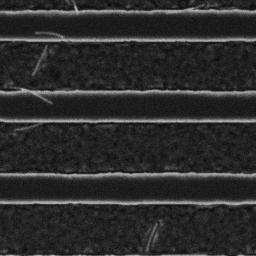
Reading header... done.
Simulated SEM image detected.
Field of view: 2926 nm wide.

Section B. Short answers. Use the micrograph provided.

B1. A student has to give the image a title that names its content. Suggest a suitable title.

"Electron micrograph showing lines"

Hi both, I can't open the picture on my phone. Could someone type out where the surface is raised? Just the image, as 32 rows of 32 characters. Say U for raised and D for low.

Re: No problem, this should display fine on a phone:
DDDDDDDDDDDDDDDDDDDDDDDDDDDDDDDD
UUUUUUUUUUUUUUUUUUUUUUUUUUUUUUUU
UUUUUUUUUUUUUUUUUUUUUUUUUUUUUUUU
UUUUUUUUUUUUUUUUUUUUUUUUUUUUUUUU
UUUUUUUUUUUUUUUUUUUUUUUUUUUUUUUU
DDDDDDDDDDDDDDDDDDDDDDDDDDDDDDDD
DDDDDDDDDDDDDDDDDDDDDDDDDDDDDDDD
DDDDDDDDDDDDDDDDDDDDDDDDDDDDDDDD
DDDDDDDDDDDDDDDDDDDDDDDDDDDDDDDD
DDDDDDDDDDDDDDDDDDDDDDDDDDDDDDDD
DDDDDDDDDDDDDDDDDDDDDDDDDDDDDDDD
UDUUUUDUDUUUUUUUUDUUUUUUUUDDDDDU
UUUUUUUUUUUUUUUUUUUUUUUUUUUUUUUU
UUUUUUUUUUUUUUUUUUUUUUUUUUUUUUUU
UUUUUUUUUUUUUUUUUUUUUUUUUUUUUUUU
DDDDDDDDDDDDDDDDDDDDDDDDDDDDDDDD
DDDDDDDDDDDDDDDDDDDDDDDDDDDDDDDD
DDDDDDDDDDDDDDDDDDDDDDDDDDDDDDDD
DDDDDDDDDDDDDDDDDDDDDDDDDDDDDDDD
DDDDDDDDDDDDDDDDDDDDDDDDDDDDDDDD
DDDDDDDDDDDDDDDDDDDDDDDDDDDDDDDD
DDDDDDDDDDDDDDDDDDDDDDDDDDDDDDDD
UUUUUUUUUUUUUUUUUUUUUUUUUUUUUUUU
UUUUUUUUUUUUUUUUUUUUUUUUUUUUUUUU
UUUUUUUUUUUUUUUUUUUUUUUUUUUUUUUU
DDDDDDDDDDDDDDDDDDDDDDDDDDDDDDDD
DDDDDDDDDDDDDDDDDDDDDDDDDDDDDDDD
DDDDDDDDDDDDDDDDDDDDDDDDDDDDDDDD
DDDDDDDDDDDDDDDDDDDDDDDDDDDDDDDD
DDDDDDDDDDDDDDDDDDDDDDDDDDDDDDDD
DDDDDDDDDDDDDDDDDDDDDDDDDDDDDDDD
DDDDDDDDDDDDDDDDDDDDDDDDDDDDDDDD